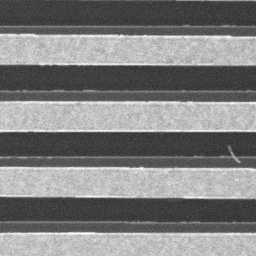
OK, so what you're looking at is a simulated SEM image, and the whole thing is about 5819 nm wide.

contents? lines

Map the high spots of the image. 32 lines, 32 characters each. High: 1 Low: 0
00000000000000000000000000000000
00000000000000000000000000000000
00000000000000000000000000000000
11111111111111111111111111111111
11111111111111111111111111111111
11111111111111111111111111111111
11111111111111111111111111111111
11111111111111111111111111111111
00000000000000000000000000000000
00000000000000000000000000000000
00000000000000000000000000000000
11111111111111111111111111111111
11111111111111111111111111111111
11111111111111111111111111111111
11111111111111111111111111111111
11111111111111111111111111111111
00000000000000000000000000000000
00000000000000000000000000000000
00000000000000000000000000000000
00000000000000000000000000000000
11111111111111111111111111111111
11111111111111111111111111111111
11111111111111111111111111111111
11111111111111111111111111111111
00000000011111111111111111111111
00000000000000000000000000000000
00000000000000000000000000000000
00000000000000000000000000000000
11111111111111111111111111111111
11111111111111111111111111111111
11111111111111111111111111111111
11111111111111111111111111111111